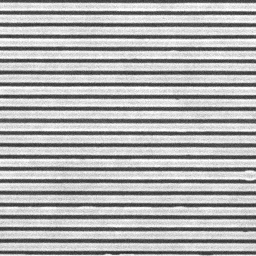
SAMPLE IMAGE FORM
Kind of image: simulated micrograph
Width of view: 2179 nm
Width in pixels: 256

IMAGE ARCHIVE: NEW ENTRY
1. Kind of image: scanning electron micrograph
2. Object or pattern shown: parallel lines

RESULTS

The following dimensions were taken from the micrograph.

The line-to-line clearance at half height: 38.3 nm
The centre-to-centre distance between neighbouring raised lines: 0.102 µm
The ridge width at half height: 61.7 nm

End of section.